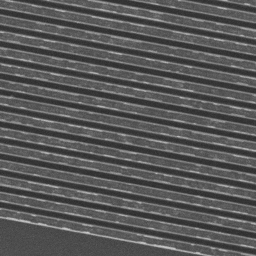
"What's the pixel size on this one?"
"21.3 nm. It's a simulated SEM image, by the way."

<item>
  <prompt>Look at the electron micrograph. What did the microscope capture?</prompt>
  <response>parallel lines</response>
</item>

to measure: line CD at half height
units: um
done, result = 0.201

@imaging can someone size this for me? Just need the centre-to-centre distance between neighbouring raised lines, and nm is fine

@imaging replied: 337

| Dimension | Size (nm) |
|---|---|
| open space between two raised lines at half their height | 146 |